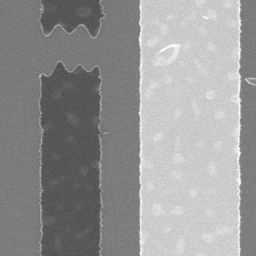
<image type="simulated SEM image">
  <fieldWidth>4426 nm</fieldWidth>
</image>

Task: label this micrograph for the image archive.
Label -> one or a few lines or trenches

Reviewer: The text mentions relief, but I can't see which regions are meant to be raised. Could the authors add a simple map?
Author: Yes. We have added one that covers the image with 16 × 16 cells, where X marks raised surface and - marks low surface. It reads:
---XXX---XXXXXX-
---XXX---XXXXXX-
---------XXXXXX-
---------XXXXXX-
---XXX---XXXXXX-
---XXX---XXXXXX-
--XXXX---XXXXXX-
---XXX---XXXXXX-
---XXX---XXXXXX-
---XXX---XXXXXX-
---XXX---XXXXXX-
---XXX---XXXXXX-
---XXX---XXXXXX-
---XXX---XXXXXX-
---XXX---XXXXXX-
---XXX---XXXXXX-